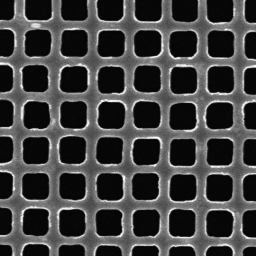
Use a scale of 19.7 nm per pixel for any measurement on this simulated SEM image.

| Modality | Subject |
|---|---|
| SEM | a regular array of holes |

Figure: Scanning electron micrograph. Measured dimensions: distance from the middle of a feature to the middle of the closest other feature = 700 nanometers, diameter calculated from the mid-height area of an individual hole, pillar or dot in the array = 579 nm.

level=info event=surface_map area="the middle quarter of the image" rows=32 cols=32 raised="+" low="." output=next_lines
++...++++++++++++++....+++++++++
......+++......+++......+++.....
......++.......+++......+++.....
......++.......+++......++......
......++.......++.......++......
......++.......++.......++......
......+++......+++......+++.....
++++++++++..++++++++++++++++....
++++++++++++++++++++++++++++++++
.....+++++....++++.....+++++++++
......+++......+++......+++.....
......+++......++.......++......
......+++......++.......++......
......++.......++.......++......
......++.......++.......++......
.....++++......+++......+++.....
+++++++++++++++++++++++++++....+
++++++++++++++++++++++++++++++++
.....++++.....++++++++++++++++++
.....+++.......++.......+++.....
......++.......++.......++......
......++.......++.......++......
......++.......++.......++......
......++.......++.......++......
.....++++.....+++.......++......
++++++++++++++++++++++++++++....
++++++++++++++++++++++++++++++++
.....++++.....++++.....+++++....
.....+++.......++.......+++.....
......++.......++.......++......
......++.......++.......++......
......++.......++.......++......